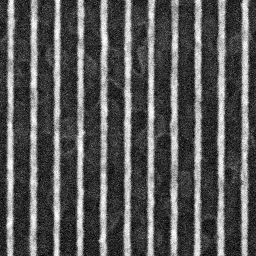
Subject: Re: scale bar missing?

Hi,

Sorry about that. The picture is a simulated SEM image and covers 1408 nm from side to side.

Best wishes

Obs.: parallel lines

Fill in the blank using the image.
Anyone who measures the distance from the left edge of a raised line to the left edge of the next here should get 129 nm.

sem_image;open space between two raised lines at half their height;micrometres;0.1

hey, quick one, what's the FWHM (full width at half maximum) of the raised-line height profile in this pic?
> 28.9 nm